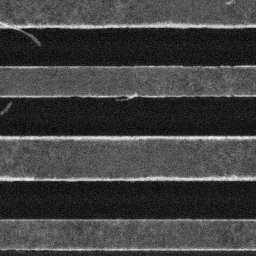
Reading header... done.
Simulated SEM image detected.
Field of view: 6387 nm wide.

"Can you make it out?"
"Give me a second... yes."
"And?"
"lines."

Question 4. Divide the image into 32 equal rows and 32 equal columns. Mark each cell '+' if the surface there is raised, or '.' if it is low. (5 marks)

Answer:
++++++++++++++++++++++++++++++++
++++++++++++++++++++++++++++++++
++++++++++++++++++++++++++++++++
+++.....+++++...............+...
................................
................................
................................
................................
++++++++++++++++++++++++++++++++
++++++++++++++++++++++++++++++++
++++++++++++++++++++++++++++++++
++++++++++++++++++++++++++++++++
................................
................................
................................
................................
................................
++++++++++++++++++++++++++++++++
++++++++++++++++++++++++++++++++
++++++++++++++++++++++++++++++++
++++++++++++++++++++++++++++++++
++++++++++++++++++++++++++++++++
++++++++++++++++++++++++++++++++
................................
................................
................................
................................
......................++........
++++++++++++++++++++++++++++++++
++++++++++++++++++++++++++++++++
++++++++++++++++++++++++++++++++
................................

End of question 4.